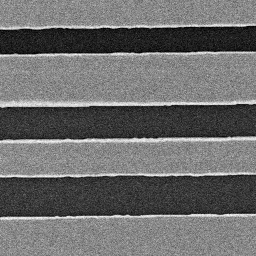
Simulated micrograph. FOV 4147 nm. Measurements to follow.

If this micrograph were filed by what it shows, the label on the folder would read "lines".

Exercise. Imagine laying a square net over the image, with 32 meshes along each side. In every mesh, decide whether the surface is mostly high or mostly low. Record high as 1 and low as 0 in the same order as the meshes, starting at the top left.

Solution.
11111111111111111111111111111111
11111111111111111111111111111111
11111111111111111111111111111111
11111111111111101000000000000000
00000000000000000000000000000000
00000000000000000000000000000000
00000000000000000000000000000000
11111111111111111111111111111111
11111111111111111111111111111111
11111111111111111111111111111111
11111111111111111111111111111111
11111111111111111111111111111111
11111111111111111111111111111111
00000000000000000000000000000000
00000000000000000000000000000000
00000000000000000000000000000000
00000000000000000000000000000000
00000000000000001111111111111111
11111111111111111111111111111111
11111111111111111111111111111111
11111111111111111111111111111111
11111111111111111111111111111111
00000000000000000000000000000000
00000000000000000000000000000000
00000000000000000000000000000000
00000000000000000000000000000000
00000000000000000000000000000000
11111111111111111111111111111111
11111111111111111111111111111111
11111111111111111111111111111111
11111111111111111111111111111111
11111111111111111111111111111111